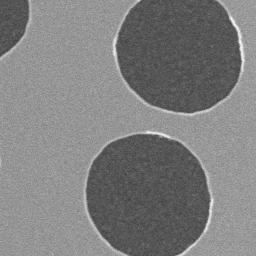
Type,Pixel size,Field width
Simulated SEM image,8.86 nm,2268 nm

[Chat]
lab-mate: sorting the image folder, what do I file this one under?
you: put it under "holes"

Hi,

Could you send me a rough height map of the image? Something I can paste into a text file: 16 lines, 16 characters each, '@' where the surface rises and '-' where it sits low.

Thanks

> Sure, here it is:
--@@@@@@------@@
--@@@@@@-------@
-@@@@@@--------@
@@@@@@@--------@
@@@@@@@@-------@
@@@@@@@@-------@
@@@@@@@@@-----@@
@@@@@@@@@@@@@@@@
@@@@@@@@--@@@@@@
@@@@@@------@@@@
@@@@@@-------@@@
@@@@@--------@@@
@@@@@--------@@@
@@@@@@-------@@@
@@@@@@-------@@@
@@@@@@@-----@@@@